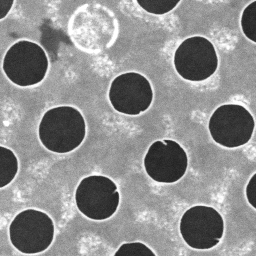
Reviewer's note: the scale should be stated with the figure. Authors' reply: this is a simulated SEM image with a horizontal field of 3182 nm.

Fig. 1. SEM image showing a regular array of holes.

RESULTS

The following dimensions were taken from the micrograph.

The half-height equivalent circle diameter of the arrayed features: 551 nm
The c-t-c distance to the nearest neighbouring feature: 0.928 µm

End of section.